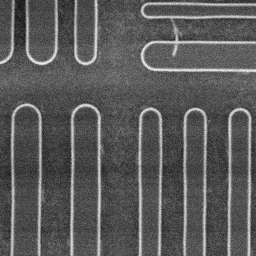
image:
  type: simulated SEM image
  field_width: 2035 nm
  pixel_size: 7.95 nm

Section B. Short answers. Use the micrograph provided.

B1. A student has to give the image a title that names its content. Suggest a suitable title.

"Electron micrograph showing groups of lines, slits or small figures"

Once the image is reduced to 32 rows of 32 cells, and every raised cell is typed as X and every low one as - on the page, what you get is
XX-XXXX---XX------XXXXXXX-------
XX-XXXX--XXX------XXXXXXXXXXXXXX
XX-XXXX--XXX--------------------
XX-XXXX--XXX--------------------
XX-XXXX--XXX--------------------
XX-XXXX--XXX-------XXXXXXXXXXXXX
XX-XXXX--XXX------XXXXXXXXXXXXXX
X---XX----XX------XXXXXXXXXXXXXX
-------------------XXXXXXXXXXXXX
--------------------------------
--------------------------------
--------------------------------
--------------------------------
--XX------XX--------------------
--XXX----XXX------XX---XXX---XX-
--XXX----XXX------XX---XXX---XX-
--XXX----XXX------XX---XXX---XX-
--XXX----XXX-----XXX---XXX---XX-
--XXX----XXX-----XXX---XXX---XX-
--XXX----XXX-----XXX---XXX---XX-
--XXX----XXX-----XXX---XXX---XX-
--XXX----XXX-----XXX---XXX---XX-
--XXX----XXX-----XXX---XXX---XX-
--XXX----XXX------XX---XXX---XX-
--XXX----XXX------XX---XXX---XX-
--XXX----XXX------XX---XXX---XX-
--XXX----XXX------XX---XXX---XX-
--XXX----XXX------XX---XXX---XX-
--XXX----XXX------XX---XXX---XX-
--XXX----XXX------XX---XXX---XX-
-XXXX----XXX------XX---XXX---XX-
-XXXX----XXX-----XXX---XXX---XX-